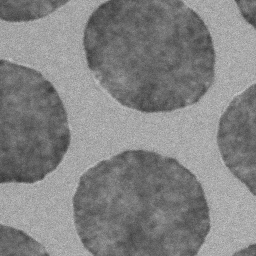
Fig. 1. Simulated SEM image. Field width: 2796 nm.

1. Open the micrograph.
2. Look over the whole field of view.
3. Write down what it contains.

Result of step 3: holes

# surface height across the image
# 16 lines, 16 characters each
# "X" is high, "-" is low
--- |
----XX------XXX-
XXXXX--------XXX
XXXXX--------XXX
XXXXX--------XXX
--XXXX-------XXX
---XXX-------XX-
----XXX-----XX--
----XXXXXXXXXX--
----XXXXXXXXXX--
----XXXX--XXXX--
----XX------XX--
XXXXX--------XX-
XXXXX--------XXX
XXXXX--------XXX
--XXX--------XXX
---XX--------XX-